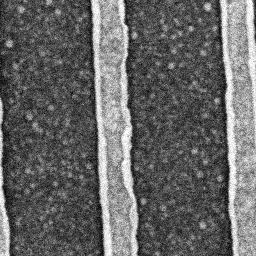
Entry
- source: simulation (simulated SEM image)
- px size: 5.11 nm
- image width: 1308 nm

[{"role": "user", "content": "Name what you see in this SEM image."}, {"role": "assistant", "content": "one or a few lines or trenches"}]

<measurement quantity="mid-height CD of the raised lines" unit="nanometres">146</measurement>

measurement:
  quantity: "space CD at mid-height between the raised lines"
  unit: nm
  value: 512